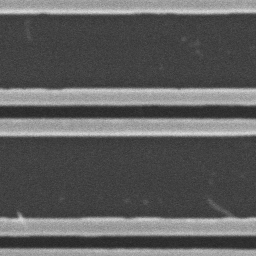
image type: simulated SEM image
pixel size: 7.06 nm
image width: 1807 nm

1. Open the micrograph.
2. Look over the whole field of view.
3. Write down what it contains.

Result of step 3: lines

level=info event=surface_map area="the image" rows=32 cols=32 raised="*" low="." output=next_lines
********************************
********************************
................................
................................
................................
................................
................................
................................
................................
................................
................................
********************************
********************************
................................
................................
********************************
********************************
................................
................................
................................
................................
................................
................................
................................
................................
................................
................................
********************************
********************************
................................
................................
********************************